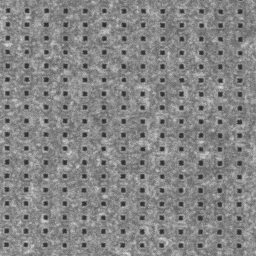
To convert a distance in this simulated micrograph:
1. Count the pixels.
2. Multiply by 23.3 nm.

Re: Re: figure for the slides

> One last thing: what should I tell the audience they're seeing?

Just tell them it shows a regular array of holes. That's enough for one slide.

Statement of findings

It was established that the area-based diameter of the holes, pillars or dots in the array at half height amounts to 0.134 micrometres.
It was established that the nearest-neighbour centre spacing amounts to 316 nm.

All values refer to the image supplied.